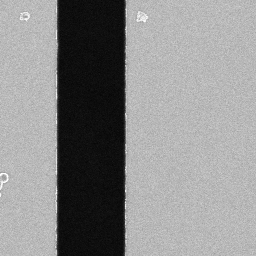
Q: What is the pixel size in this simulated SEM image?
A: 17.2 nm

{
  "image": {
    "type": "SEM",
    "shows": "one or a few lines or trenches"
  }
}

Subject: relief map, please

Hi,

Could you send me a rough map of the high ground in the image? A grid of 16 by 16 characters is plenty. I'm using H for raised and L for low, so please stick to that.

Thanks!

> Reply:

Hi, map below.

LLLLHHHHLLLLLLLL
LLLLHHHHLLLLLLLL
LLLLHHHHLLLLLLLL
LLLLHHHHLLLLLLLL
LLLLHHHHLLLLLLLL
LLLLHHHHLLLLLLLL
LLLLHHHHLLLLLLLL
LLLLHHHHLLLLLLLL
LLLLHHHHLLLLLLLL
LLLLHHHHLLLLLLLL
LLLLHHHHLLLLLLLL
LLLLHHHHLLLLLLLL
LLLLHHHHLLLLLLLL
LLLLHHHHLLLLLLLL
LLLLHHHHLLLLLLLL
LLLLHHHHLLLLLLLL